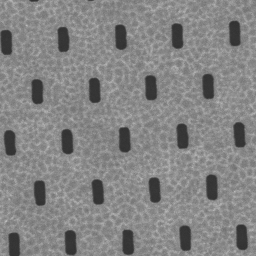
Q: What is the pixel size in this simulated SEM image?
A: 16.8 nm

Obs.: a regular array of holes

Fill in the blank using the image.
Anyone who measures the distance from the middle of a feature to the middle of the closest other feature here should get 956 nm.